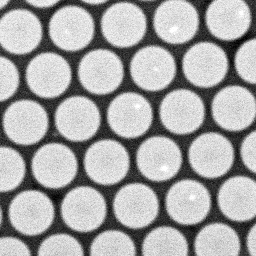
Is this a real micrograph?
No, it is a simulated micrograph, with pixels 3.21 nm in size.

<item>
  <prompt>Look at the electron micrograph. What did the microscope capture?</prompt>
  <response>an array of small figures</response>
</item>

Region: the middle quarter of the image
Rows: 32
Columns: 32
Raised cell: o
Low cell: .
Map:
o...oooooooooo...ooooooooooo..oo
o...ooooooooooo..ooooooooooo..oo
oo..ooooooooooo..oooooooooo...oo
oo..oooooooooo...oooooooooo....o
o...oooooooooo....oooooooo......
o....oooooooo......oooooo.......
......oooooo.........o..........
...............ooo........oooooo
..ooo........ooooooo.....ooooooo
ooooooo.....ooooooooo....ooooooo
oooooooo...oooooooooo...oooooooo
oooooooo...ooooooooooo..oooooooo
ooooooooo..ooooooooooo..oooooooo
ooooooooo..ooooooooooo..oooooooo
ooooooooo..ooooooooooo...ooooooo
ooooooooo...ooooooooo....ooooooo
oooooooo....ooooooooo.....oooooo
ooooooo.......ooooo.............
.ooooo................ooo.......
.........oooo.......ooooooo.....
.......ooooooo.....ooooooooo....
o.....ooooooooo....oooooooooo..o
oo....oooooooooo..ooooooooooo..o
ooo..ooooooooooo..ooooooooooo..o
ooo..ooooooooooo..ooooooooooo...
ooo..ooooooooooo...oooooooooo...
ooo..ooooooooooo...ooooooooo....
ooo...ooooooooo.....oooooooo....
oo.....oooooooo......ooooo......
o.......ooooo................ooo
................oooo.......ooooo
..ooooo.......oooooooo.....ooooo